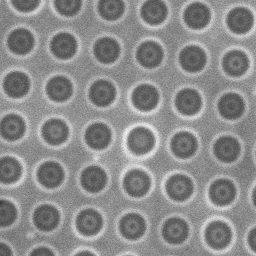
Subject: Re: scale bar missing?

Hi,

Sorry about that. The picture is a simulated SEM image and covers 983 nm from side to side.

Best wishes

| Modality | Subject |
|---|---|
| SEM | an array of small figures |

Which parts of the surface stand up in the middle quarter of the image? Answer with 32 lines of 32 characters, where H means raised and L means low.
HHHHHHHHHHHHHHHHHHHLLLLLHHHHHLLL
HHHHHHHHHHHHHHHHHHHHHHHHHHHHHHLL
HHHHHHHHHHHHHHHHHHHHHHHHHHHHHHHH
LHHHHHHHHLHHHHHHHHHHHHHHHHHHHHHH
LLHHHHHLLLLLHHHHHHHHHHHHHHHHHHHH
LLHHHHLLLLLLLHHHHHLLLLLHHHHHHHHH
LLHHHHLLHHHLLHHHHLLLLLLHHHHHHLLL
LLHHHHLLHHHLLHHHHLLHHLLLHHHHLLLL
LLHHHHLLLHLLLHHHLLLHHHLLHHHHLLHH
HHHHHHHLLLLLLHHHLLLHHLLLHHHLLLHH
HHHHHHHHLLLLHHHHHLLLLLLLHHHLLLHH
HHHHHHHHHHHHHHHHHHLLLLHHHHHHLLLL
HHHHHHHHHHHHHHHHHHHHHHHHHHHHHLLL
HHHHHHHHHHHHHHHHHHHHHHHHHHHHHHHH
HHHHHHHLLLHHHHHHHHHHHHHHHHHHHHHH
LHHHHHLLLLLHHHHHHLLLLHHHHHHHHHHH
LLHHHLLLLLLLHHHHLLLLLLHHHHHHHHHH
LLHHHLLHHHLLHHHHLLLLLLLHHHHHLLLL
LHHHHLLHHHLLHHHLLLLHLLLHHHHLLLLL
HHHHHLLLHLLLHHHLLLHHLLLHHHLLLHHL
HHHHHHLLLLLHHHHLLLLLLLLHHHLLLHHL
HHHHHHHLLLHHHHHHLLLLLLHHHHLLLLLL
HHHHHHHHHHHHHHHHHLLLLHHHHHHLLLLL
HHHHHHHHHHHHHHHHHHHHHHHHHHHHLLLL
HHHHHHHHHHHHHHHHHHHHHHHHHHHHHHHH
HHHHHHLLLHHHHHHHHHHHHHHHHHHHHHHH
HHHHHLLLLLHHHHHHLLLLHHHHHHHHHHHH
HHHHLLLHLLLHHHHLLLLLLHHHHHHLLLHH
HHHHLLHHHLLHHHHLLLLLLLHHHHLLLLLL
HHHHLLHHHLLHHHLLLHHLLLHHHLLLLLLL
HHHHLLLLLLLHHHHLLHHLLLHHHLLLHHLL
HHHHHLLLLLHHHHHLLLLLLLHHHLLLHHLL